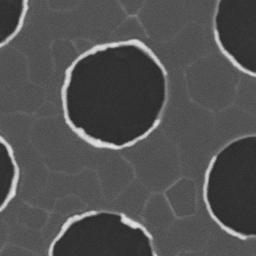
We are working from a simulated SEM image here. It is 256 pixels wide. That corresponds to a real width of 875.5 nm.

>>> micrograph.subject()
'holes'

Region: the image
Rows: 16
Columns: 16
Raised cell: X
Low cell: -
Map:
-XXXXXXXXXXXXX--
-XXXXXXXXXXXXX--
XXXXXXXXXXXXXX--
XXXXXX---XXXXX--
XXXXX-----XXXXXX
XXXX------XXXXXX
XXXX------XXXXXX
XXXX------XXXXXX
XXXXXX---XXXXXXX
XXXXXXXXXXXXXX--
-XXXXXXXXXXXX---
-XXXXXXXXXXXX---
XXXXXXXXXXXXX---
XXXXXX-XXXXXX---
XXXX-----XXXXXX-
XXX------XXXXXXX